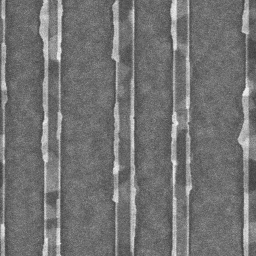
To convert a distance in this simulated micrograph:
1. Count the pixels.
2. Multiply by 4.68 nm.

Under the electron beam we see one or a few lines or trenches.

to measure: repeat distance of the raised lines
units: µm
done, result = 0.303